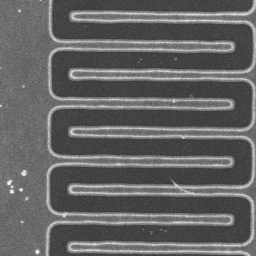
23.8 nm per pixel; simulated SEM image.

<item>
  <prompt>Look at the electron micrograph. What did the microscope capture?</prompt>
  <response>groups of lines, slits or small figures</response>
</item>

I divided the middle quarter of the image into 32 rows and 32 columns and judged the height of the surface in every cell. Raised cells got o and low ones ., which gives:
................................
..ooo...........................
.ooooooooooooooooooooooooooooooo
..oooooooooooooooooooooooooooooo
................................
................................
................................
................................
................................
oooooooooooooooooooooooooooooooo
oooooooooooooooooooooooooooooooo
................................
................................
................................
................................
................................
..oooooooooooooooooooooooooooooo
..oooooooooooooooooooooooooooooo
................................
................................
................................
................................
................................
oooooooooooooooooooooooooooooooo
oooooooooooooooooooooooooooooooo
................................
................................
................................
................................
................................
..ooooooooooooooo..ooooo...oo...
.ooooooooooooooooooooooooooooooo